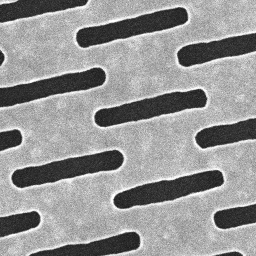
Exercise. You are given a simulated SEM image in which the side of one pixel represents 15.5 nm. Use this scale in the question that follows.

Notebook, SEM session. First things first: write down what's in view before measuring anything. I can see holes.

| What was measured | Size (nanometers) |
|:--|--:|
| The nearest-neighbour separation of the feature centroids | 1290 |